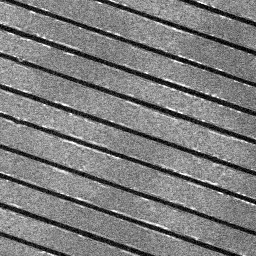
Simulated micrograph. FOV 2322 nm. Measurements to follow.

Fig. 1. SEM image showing parallel lines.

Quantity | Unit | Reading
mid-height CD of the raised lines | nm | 53.6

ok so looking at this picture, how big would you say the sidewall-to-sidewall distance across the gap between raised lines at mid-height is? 0.19 micrometres